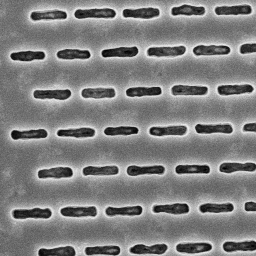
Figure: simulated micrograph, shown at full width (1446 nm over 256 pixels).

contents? a regular array of holes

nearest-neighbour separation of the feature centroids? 253 nm